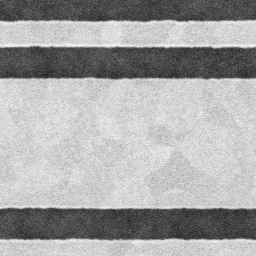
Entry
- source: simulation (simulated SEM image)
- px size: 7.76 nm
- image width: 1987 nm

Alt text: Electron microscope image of lines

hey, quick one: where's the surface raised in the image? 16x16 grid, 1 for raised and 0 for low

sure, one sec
0000000000000000
1111111111111111
1111111111111111
0000000000000000
0000000000000000
1111111111111111
1111111111111111
1111111111111111
1111111111111111
1111111111111111
1111111111111111
1111111111111111
1111111111111111
0000000000000000
0000000000000000
1111111111111111